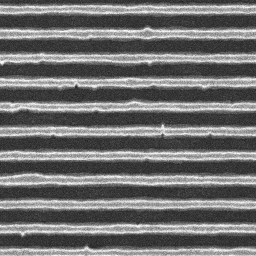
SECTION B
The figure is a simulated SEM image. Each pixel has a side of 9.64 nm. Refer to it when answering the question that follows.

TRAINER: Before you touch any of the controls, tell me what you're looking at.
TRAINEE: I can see parallel lines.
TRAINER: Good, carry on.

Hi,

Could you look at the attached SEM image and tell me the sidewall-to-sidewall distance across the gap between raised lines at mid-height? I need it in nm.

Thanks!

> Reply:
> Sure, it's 147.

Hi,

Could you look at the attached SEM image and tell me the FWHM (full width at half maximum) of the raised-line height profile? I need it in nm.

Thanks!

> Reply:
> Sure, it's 90.4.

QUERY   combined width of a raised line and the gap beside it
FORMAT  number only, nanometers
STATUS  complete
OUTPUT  235